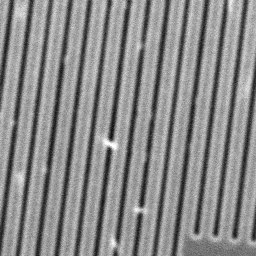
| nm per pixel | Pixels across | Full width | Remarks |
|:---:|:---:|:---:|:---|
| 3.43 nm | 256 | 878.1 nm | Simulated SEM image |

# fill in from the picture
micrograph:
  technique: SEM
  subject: parallel lines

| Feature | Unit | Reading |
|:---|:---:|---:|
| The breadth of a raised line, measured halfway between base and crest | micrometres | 0.0438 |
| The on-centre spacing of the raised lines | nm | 66.3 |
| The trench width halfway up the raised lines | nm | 20.4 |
